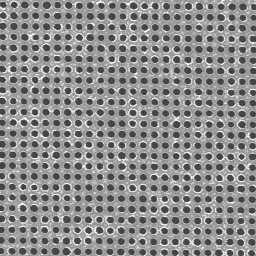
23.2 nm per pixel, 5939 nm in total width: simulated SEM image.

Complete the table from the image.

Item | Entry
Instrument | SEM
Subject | a regular array of holes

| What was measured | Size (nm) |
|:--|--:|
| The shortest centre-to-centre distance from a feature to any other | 244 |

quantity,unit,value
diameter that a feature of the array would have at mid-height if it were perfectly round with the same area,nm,161